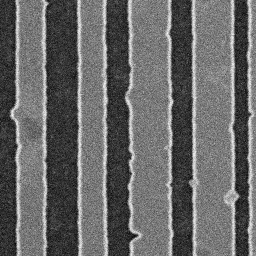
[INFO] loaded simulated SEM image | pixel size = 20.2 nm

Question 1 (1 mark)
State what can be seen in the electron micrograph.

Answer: one or a few lines or trenches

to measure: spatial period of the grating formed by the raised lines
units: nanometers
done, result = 1230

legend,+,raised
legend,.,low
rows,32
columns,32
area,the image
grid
..++++....+++...+++++...+++++..+
..++++....+++...+++++...+++++..+
..++++....+++...+++++...+++++..+
..++++....+++...+++++...+++++..+
..++++....+++...+++++...+++++..+
..++++....+++...+++++...+++++..+
..++++....+++...+++++...+++++..+
..++++....+++...+++++...+++++..+
..++++....+++...+++++...+++++..+
..++++....+++...+++++...+++++..+
..++++....+++...+++++...+++++..+
..++++....+++...+++++...+++++..+
..++++....+++...+++++...+++++..+
..++++....+++...+++++...+++++..+
..++++....+++...+++++...+++++..+
..++++....+++...+++++...+++++..+
..++++....+++...+++++...+++++..+
..++++....+++...+++++...+++++..+
..++++....+++...+++++...+++++..+
..++++....+++....++++...+++++..+
..++++....+++...+++++...+++++..+
..++++....+++...+++++...+++++..+
..++++....+++...+++++...+++++..+
..++++....+++...+++++...+++++..+
..++++....+++...+++++...++++++.+
..++++....+++...+++++...+++++..+
..++++....+++...+++++...+++++..+
..++++....+++...+++++...+++++..+
..++++....+++...+++++...+++++..+
..++++....+++....++++...+++++..+
..++++....+++...+++++...+++++..+
..++++....+++...+++++...+++++..+